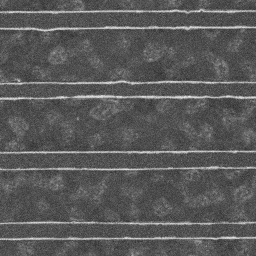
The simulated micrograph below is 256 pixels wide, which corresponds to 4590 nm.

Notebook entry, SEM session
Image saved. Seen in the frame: one or a few lines or trenches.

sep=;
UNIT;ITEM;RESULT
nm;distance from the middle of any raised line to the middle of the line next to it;1260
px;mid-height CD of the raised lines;16.4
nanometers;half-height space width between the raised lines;977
